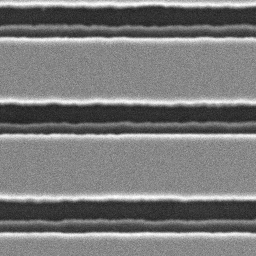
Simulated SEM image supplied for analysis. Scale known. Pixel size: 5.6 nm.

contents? lines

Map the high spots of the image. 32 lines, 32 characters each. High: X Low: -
XXXXXXXXXXXXXXXXXXX-XXXXXXXXXXXX
--------------------------------
--------------------------------
--------------------------------
--------------------------------
XXXXXXXXXXXXXXXXXXXXXXXXXXXXXXXX
XXXXXXXXXXXXXXXXXXXXXXXXXXXXXXXX
XXXXXXXXXXXXXXXXXXXXXXXXXXXXXXXX
XXXXXXXXXXXXXXXXXXXXXXXXXXXXXXXX
XXXXXXXXXXXXXXXXXXXXXXXXXXXXXXXX
XXXXXXXXXXXXXXXXXXXXXXXXXXXXXXXX
XXXXXXXXXXXXXXXXXXXXXXXXXXXXXXXX
XXXXXXXXXXXXXXXXXXXXXXXXXXXXXXXX
--------------------------------
--------------------------------
--------------------------------
--------------------------------
XXXXXXXXXXXXXXXXXXXXXXXXXXXXXXXX
XXXXXXXXXXXXXXXXXXXXXXXXXXXXXXXX
XXXXXXXXXXXXXXXXXXXXXXXXXXXXXXXX
XXXXXXXXXXXXXXXXXXXXXXXXXXXXXXXX
XXXXXXXXXXXXXXXXXXXXXXXXXXXXXXXX
XXXXXXXXXXXXXXXXXXXXXXXXXXXXXXXX
XXXXXXXXXXXXXXXXXXXXXXXXXXXXXXXX
XXXXXXXXXXXXXXXXXXXXXXXXXXXXXXXX
--------------------------------
--------------------------------
--------------------------------
--------------------------------
XXXXXXXXXXXXXXXXXXXXXXXXXXXXXXXX
XXXXXXXXXXXXXXXXXXXXXXXXXXXXXXXX
XXXXXXXXXXXXXXXXXXXXXXXXXXXXXXXX